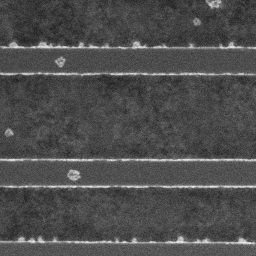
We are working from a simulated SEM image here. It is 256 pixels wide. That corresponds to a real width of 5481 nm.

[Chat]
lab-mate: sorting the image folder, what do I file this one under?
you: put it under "lines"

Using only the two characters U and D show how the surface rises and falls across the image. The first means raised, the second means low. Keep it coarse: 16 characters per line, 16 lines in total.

DDDDDDDDDDDDDDDD
DDDDDDDDDDDDDDDD
DDDDDDDDDDDDDDDD
UUUUUUUUUUUUUUUU
UUUUUUUUUUUUUUUU
DDDDDDDDDDDDDDDD
DDDDDDDDDDDDDDDD
DDDDDDDDDDDDDDDD
DDDDDDDDDDDDDDDD
DDDDDDDDDDDDDDDD
UUUUUUUUUUUUUUUU
UUUUUUUUUUUUUUUU
DDDDDDDDDDDDDDDD
DDDDDDDDDDDDDDDD
DDDDDDDDDDDDDDDD
UUUUUUUUUUUUUUUU